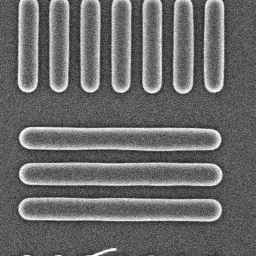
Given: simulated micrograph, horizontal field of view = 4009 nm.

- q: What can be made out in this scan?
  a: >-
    groups of lines, slits or small figures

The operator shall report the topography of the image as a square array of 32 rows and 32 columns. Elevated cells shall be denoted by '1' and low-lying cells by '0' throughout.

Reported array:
00111011001100110011001100110000
00111011101100110011001100110000
00111011001100110011001100110000
00111011001100110011001100110000
00111011001100110011001100110000
00111011001100110011001100110000
00111011001100110011001100110000
00111011001100110011001100110000
00111011001100110011001100110000
00111011001100110011001100110000
00111011001100110011001100110000
00010000000100000010001000100000
00000000000000000000000000000000
00000000000000000000000000000000
00000000000000000000000000000000
00000000000000000000000000000000
00011111111111111111111111100000
00111111111111111111111111100000
00011111111111111111111111100000
00000000000000000000000000000000
00000001111100000011100000000000
00111111111111111111111111110000
00011111111111111111111111110000
00000000000000000000000000000000
00000000000000000000000000000000
00011111111111111111111111100000
00111111111111111111111111110000
00000011111111111111111111100000
00000000000000000000000000000000
00000000000000000000000000000000
00000000000000000000000000000000
00000000000000000000000000000000